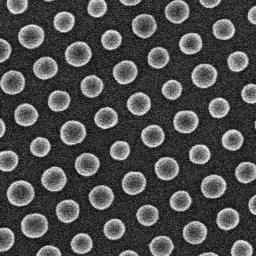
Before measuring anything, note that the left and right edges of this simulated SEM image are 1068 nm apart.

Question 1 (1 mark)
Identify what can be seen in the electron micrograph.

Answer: a regular array of raised bodies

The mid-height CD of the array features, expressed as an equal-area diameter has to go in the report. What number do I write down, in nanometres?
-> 90.2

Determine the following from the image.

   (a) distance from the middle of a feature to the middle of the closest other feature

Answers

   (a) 34.9 pixels